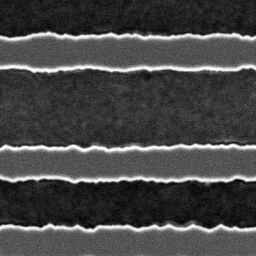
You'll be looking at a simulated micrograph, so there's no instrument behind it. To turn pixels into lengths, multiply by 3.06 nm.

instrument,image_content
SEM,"lines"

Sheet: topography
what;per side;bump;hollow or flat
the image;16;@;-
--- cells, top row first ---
----------------
----------------
@@@@@@@@@@@@@@@@
@@@@@@@@@@@@@@@@
----------------
----------------
----------------
----------------
----------------
@@@@@@@@@@@@@@@@
@@@@@@@@@@@@@@@@
----------------
----------------
----------------
@@@@@@@@@@@@@@@@
@@@@@@@@@@@@@@@@